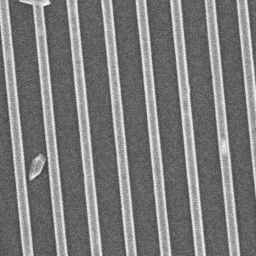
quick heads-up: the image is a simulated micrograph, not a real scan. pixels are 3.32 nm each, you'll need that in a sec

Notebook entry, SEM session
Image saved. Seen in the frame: parallel lines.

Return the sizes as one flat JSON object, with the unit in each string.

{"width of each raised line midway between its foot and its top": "28.9 nanometres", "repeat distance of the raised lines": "114 nm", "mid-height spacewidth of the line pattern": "84 nm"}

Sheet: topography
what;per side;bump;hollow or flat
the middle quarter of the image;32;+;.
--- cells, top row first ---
...++......++.......++......++..
...++......++.......++......++..
...++.......++......++.......++.
...++.......++......++.......++.
...++.......++......++.......++.
...++.......++......++.......++.
...++.......++......++.......++.
...++.......++.......++......++.
...++.......++.......++......++.
...++.......++.......++......++.
....++......++.......++......++.
....++......++.......++......++.
....++......+++......++.......++
....++......+++......++.......++
....++......+++......++.......++
....++.......++......++.......++
....++.......++......++.......++
....++.......++.......++......++
....++.......++.......++......++
....++.......++.......++......++
.....++......++.......++......++
.....++......++.......++......++
.....++......++.......++.......+
.....++.......++......++.......+
.....++.......++......++.......+
.....++.......++......++.......+
.....++.......++......++.......+
.....++.......++.......++......+
.....++.......++.......++......+
.....++.......++.......++......+
......++......++.......++......+
......++......++.......++......+